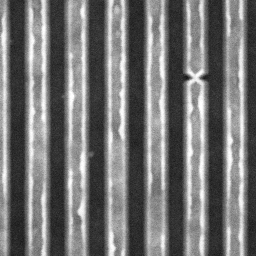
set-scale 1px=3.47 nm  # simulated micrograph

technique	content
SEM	parallel lines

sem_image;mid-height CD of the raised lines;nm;68.5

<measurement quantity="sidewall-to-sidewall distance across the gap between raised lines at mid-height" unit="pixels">19.7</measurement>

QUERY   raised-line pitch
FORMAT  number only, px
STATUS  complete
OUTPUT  39.5